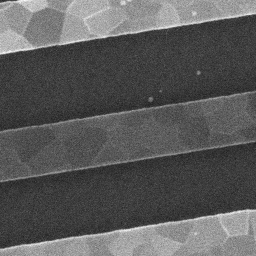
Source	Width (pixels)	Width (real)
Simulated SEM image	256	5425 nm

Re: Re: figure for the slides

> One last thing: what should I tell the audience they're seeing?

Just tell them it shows lines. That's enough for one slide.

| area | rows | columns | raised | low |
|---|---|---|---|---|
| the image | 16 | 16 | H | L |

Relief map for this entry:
HHHHHHHHHHHHHHHH
HHHHHHHHHHHHLLLL
HHHHHLLLLLLLLLLL
LLLLLLLLLLLLLLLL
LLLLLLLLLLLLLLLL
LLLLLLLLLLLLLLLL
LLLLLLLLLLLHHHHH
LLLLLHHHHHHHHHHH
HHHHHHHHHHHHHHHH
HHHHHHHHHHHHLLLL
HHHHHLLLLLLLLLLL
LLLLLLLLLLLLLLLL
LLLLLLLLLLLLLLLL
LLLLLLLLLLLLLHHH
LLLLLLLHHHHHHHHH
LHHHHHHHHHHHHHHH